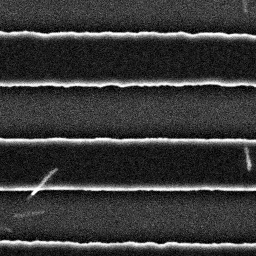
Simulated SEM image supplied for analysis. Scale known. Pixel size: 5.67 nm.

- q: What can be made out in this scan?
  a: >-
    lines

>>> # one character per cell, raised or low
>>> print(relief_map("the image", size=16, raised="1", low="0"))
0000000000000000
0000000000000000
1111111111111111
1111111111111111
1111111111111111
0000000000000000
0000000000000000
0000000000000000
0000000000000000
1111111111111111
1111111111111111
1111111111111111
0000000000000000
0000000000000000
0000000000000000
1111111111111111